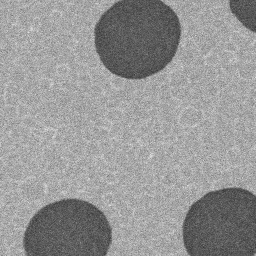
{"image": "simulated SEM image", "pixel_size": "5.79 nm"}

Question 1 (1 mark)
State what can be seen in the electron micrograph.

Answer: holes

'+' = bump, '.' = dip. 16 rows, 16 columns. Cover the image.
+++++++....+++..
++++++.....++++.
++++++.....+++++
++++++.....+++++
+++++++...++++++
++++++++++++++++
++++++++++++++++
++++++++++++++++
++++++++++++++++
++++++++++++++++
++++++++++++++++
++++++++++++++++
++++.+++++++....
++.....+++++....
++.....++++.....
++.....+++++....